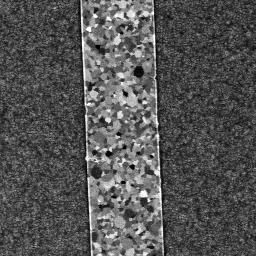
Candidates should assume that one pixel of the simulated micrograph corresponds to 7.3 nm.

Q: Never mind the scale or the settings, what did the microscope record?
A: one or a few lines or trenches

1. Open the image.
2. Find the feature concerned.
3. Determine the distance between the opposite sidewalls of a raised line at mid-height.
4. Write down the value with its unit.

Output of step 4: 0.525 microns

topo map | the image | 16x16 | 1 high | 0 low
0000011111000000
0000011111000000
0000011111000000
0000011111000000
0000011111000000
0000011111000000
0000011111000000
0000011111000000
0000011111000000
0000011111000000
0000011111000000
0000001111000000
0000001111000000
0000001111000000
0000001111000000
0000001111000000